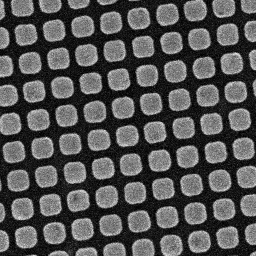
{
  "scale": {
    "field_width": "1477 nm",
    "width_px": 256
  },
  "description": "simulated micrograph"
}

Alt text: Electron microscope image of a regular array of raised bodies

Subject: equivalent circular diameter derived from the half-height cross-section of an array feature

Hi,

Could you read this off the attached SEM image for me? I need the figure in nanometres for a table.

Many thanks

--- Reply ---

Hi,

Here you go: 129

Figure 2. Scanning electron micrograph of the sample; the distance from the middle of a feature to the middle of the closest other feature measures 0.163 um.